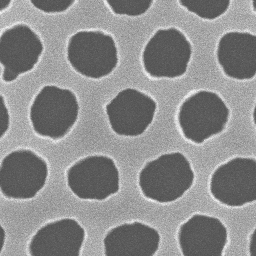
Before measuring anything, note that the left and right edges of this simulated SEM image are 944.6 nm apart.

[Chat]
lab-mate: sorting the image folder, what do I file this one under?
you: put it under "holes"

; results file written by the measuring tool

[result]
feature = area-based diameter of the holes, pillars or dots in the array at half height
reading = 182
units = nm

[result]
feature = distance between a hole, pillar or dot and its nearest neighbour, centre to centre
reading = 0.256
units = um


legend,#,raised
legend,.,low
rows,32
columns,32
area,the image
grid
.###.....#####.....####......###
######.#######....######....####
################################
##..############################
.....####.....#####....#####....
.....####.....####......###.....
.....###.......###......###.....
.....####......###......###.....
....#####.....####.....#####....
..#########..######...#######...
################################
#####....######..########.######
####......####.....####.....####
.###......###......####.....####
.###......###......###.......###
.###.....#####.....###......####
.####...######....#####.....####
########################..######
################################
#....#######.#######...#########
......###.....####......####....
......###......###......###.....
......##.......##.......##......
.....####......###......##......
#...######....####.....####.....
############################...#
################################
#######..###############...#####
#####.....####.....####.....####
.###.......##.......##......###.
####......###.......##......###.
####......###......####.....###.